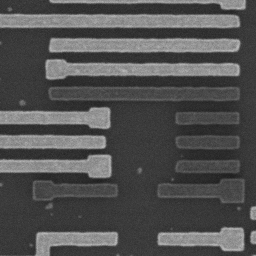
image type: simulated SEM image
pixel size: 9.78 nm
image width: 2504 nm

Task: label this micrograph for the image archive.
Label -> wiring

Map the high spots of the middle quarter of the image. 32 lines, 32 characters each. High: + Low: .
++++++++++++++++++++++++++++++++
++++++++++++++++++++++++++++++++
++++++++++++++++++++++++++++++++
................................
................................
................................
++++++++++++++++++++++++++++++++
++++++++++++++++++++++++++++++++
++++++++++++++++++++++++++++++++
................................
................................
......+++++.....................
+++++++++++.................++++
+++++++++++.................++++
+++++++++++.................++++
......+++++.....................
................................
................................
++++++++++..................++++
++++++++++..................++++
++++++++++..................++++
................................
................................
......+++++.....................
+++++++++++..................+++
+++++++++++.................++++
+++++++++++.................++++
......+++++.....................
................................
................................
+++++++++++++...........++++++++
+++++++++++++...........++++++++